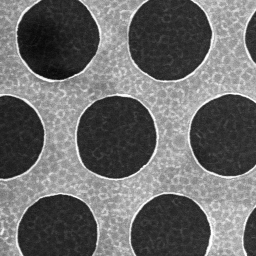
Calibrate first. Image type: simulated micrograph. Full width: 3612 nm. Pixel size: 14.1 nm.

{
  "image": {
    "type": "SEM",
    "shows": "holes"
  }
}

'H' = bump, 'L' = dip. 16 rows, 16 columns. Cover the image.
HHLLLHHHHLLLLHHH
HLLLLLHHLLLLLHHL
HLLLLLHHLLLLLHHL
HLLLLLHHLLLLLHHH
HHLLLHHHHLLLHHHH
HHHHHHHHHHHHHHHH
LLHHHHLLLHHHHLLL
LLLHHLLLLLHHLLLL
LLLHHLLLLLHHLLLL
LLLHHLLLLLHHLLLL
LLHHHLLLLHHHHLLL
HHHHHHHHHHHHHHHH
HHLLLHHHHLLLHHHH
HLLLLLHHLLLLLHHH
HLLLLLHHLLLLLHHL
HLLLLLHHLLLLLHHL